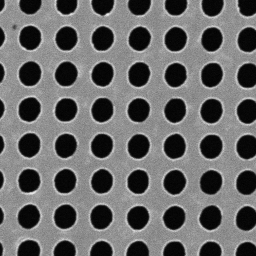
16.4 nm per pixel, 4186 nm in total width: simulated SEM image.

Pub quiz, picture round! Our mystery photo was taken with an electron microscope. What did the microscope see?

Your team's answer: a regular array of holes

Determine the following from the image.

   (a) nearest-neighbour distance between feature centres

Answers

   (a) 0.582 um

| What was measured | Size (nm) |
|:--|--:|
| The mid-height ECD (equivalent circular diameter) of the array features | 388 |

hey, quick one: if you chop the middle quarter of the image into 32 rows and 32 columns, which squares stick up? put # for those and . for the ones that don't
...#####....#####....#####....##
...####.....####......###......#
....###......###......###......#
...####.....####.....####......#
...####.....####.....#####....##
.########..######...######...###
################################
################################
.########.########.########..###
...#####....#####....#####....##
...####.....####.....####.....##
....###.....####.....####......#
...####.....####.....####.....##
...####.....####.....####.....##
.#######..########.#######...###
################################
################################
..#######.#################..###
...####.....#####....#####....##
...####.....####.....####.....##
...####.....####......###......#
...####.....####.....####.....##
..#####.....####.....####.....##
.########.#######...######...###
################################
################################
..#######.########..#######..###
...####.....####.....#####....##
...####.....####.....####......#
...####.....####.....####......#
...####.....####.....####.....##
..#####....#####.....####.....##